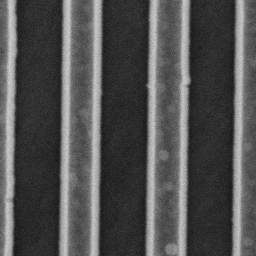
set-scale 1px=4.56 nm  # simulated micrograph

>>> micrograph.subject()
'one or a few lines or trenches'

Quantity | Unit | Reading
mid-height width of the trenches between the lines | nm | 237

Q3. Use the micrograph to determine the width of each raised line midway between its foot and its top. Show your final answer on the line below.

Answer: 0.155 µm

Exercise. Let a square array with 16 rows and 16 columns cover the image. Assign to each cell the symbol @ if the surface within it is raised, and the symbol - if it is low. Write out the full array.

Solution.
@---@@----@@---@
@---@@----@@---@
@---@@----@@---@
@---@@---@@@---@
@---@@---@@@---@
@---@@---@@@---@
@---@@---@@@---@
@---@@---@@@---@
@---@@---@@@---@
@---@@---@@@---@
@---@@---@@----@
@---@@---@@@---@
@---@@---@@----@
@---@@---@@@---@
@---@@---@@----@
@---@@---@@----@